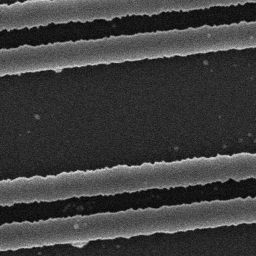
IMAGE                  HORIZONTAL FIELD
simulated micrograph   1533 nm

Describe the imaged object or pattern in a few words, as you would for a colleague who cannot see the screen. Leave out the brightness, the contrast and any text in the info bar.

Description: lines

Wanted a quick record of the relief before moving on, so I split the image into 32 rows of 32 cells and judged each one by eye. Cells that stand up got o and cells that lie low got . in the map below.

..oooooooooooooooooooooooooooo..
oooooooooooooooooooo............
oooooooooooo....................
oooo....................oooooooo
...............ooooooooooooooooo
......oooooooooooooooooooooooooo
oooooooooooooooooooooooooo......
ooooooooooooooooo...............
oooooooo........................
................................
................................
................................
................................
................................
................................
................................
................................
................................
................................
...........................ooooo
..................oooooooooooooo
.........ooooooooooooooooooooooo
.ooooooooooooooooooooooooooo.o..
ooooooooooooooooooooo...........
oooooooooooo....................
oo......................oooooooo
...............ooooooooooooooooo
......oooooooooooooooooooooooooo
oooooooooooooooooooooooooo......
ooooooooooooooooo...............
ooooooo.........................
................................